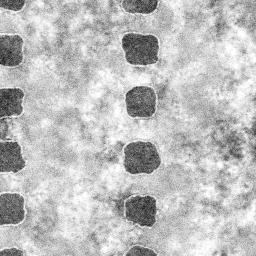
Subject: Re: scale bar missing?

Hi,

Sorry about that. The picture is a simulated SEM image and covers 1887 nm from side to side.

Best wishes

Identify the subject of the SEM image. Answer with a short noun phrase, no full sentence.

raised bodies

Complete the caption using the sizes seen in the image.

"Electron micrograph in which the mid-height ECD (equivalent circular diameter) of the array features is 0.265 um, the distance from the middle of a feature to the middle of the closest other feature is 0.389 microns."